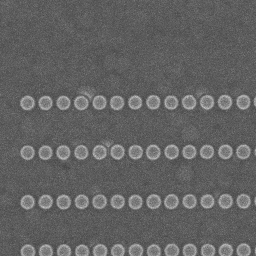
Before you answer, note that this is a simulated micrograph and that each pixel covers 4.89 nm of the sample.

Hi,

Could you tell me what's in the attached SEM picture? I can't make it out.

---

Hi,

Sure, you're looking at a regular array of raised bodies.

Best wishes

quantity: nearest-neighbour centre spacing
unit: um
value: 0.0873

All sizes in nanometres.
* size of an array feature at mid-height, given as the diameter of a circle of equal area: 65.3